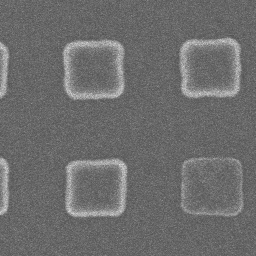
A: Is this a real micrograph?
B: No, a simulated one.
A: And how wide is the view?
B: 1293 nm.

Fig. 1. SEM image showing raised bodies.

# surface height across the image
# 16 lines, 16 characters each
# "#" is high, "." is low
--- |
................
................
................
....####...####.
....####...####.
....####....###.
................
................
................
................
....####........
....####........
....####........
................
................
................